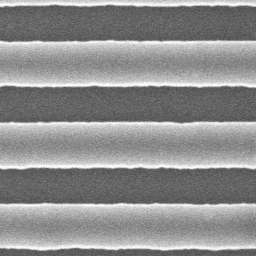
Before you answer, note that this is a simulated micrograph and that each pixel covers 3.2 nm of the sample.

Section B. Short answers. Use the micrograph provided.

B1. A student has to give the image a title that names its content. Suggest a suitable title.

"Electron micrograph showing lines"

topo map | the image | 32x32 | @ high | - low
@@@@@@-@@@@@@@@@@@@@@@@@@@@@@@@@
--------------------------------
--------------------------------
--------------------------------
--------------------------------
@@@@@@@@@@@@@@@@@@@@@@@@@@@@@@@@
@@@@@@@@@@@@@@@@@@@@@@@@@@@@@@@@
@@@@@@@@@@@@@@@@@@@@@@@@@@@@@@@@
@@@@@@@@@@@@@@@@@@@@@@@@@@@@@@@@
@@@@@@@@@@@@@@@@@@@@@@@@@@@@@@@@
@@@@@@@@@@@@@@@@@@@@@@@@@@@@@@@@
--------------------------------
--------------------------------
--------------------------------
--------------------------------
@@@@@@@@@@@@@@@@@@@@@@@@@@@@@@@@
@@@@@@@@@@@@@@@@@@@@@@@@@@@@@@@@
@@@@@@@@@@@@@@@@@@@@@@@@@@@@@@@@
@@@@@@@@@@@@@@@@@@@@@@@@@@@@@@@@
@@@@@@@@@@@@@@@@@@@@@@@@@@@@@@@@
@@@@@@@@@@@@@@@@@@@@@@@@@@@@@@@@
--------------------------------
--------------------------------
--------------------------------
--------------------------------
-----@@--------@---@----------@-
@@@@@@@@@@@@@@@@@@@@@@@@@@@@@@@@
@@@@@@@@@@@@@@@@@@@@@@@@@@@@@@@@
@@@@@@@@@@@@@@@@@@@@@@@@@@@@@@@@
@@@@@@@@@@@@@@@@@@@@@@@@@@@@@@@@
@@@@@@@@@@@@@@@@@@@@@@@@@@@@@@@@
--------------------------------